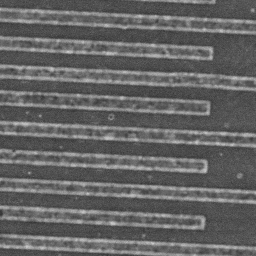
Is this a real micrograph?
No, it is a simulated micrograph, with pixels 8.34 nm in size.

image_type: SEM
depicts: parallel lines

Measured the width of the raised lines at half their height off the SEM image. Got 85.4 nm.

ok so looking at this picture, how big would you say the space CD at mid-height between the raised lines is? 150 nm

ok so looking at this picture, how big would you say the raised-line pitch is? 235 nanometres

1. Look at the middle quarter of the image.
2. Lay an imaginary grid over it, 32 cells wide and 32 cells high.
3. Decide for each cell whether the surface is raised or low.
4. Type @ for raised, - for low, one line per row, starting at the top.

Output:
--------------------------------
@@@-----------------------------
@@@@@@@@@@@@@@@@@@@@@@@---------
@@@@@@@@@@@@@@@@@@@@@@@@@@@@@@@@
----------------@@@@@@@@@@@@@@@@
--------------------------------
--------------------------------
--------------------------------
@@@@@@@@@@----------------------
@@@@@@@@@@@@@@@@@@@@@@@@@@@@@@--
@@@@@@@@@@@@@@@@@@@@@@@@@@@@@@@@
-------------------@@@@@@@@@@@@@
--------------------------------
--------------------------------
--------------------------------
@-------------------------------
@@@@@@@@@@@@@@@@@@@@@-----------
@@@@@@@@@@@@@@@@@@@@@@@@@@@@@@@@
---------@@@@@@@@@@@@@@@@@@@@@@@
------------------------------@@
--------------------------------
--------------------------------
--------------------------------
@@@@@@@@@@@@@@@@@@@@------------
@@@@@@@@@@@@@@@@@@@@@@@@@@@@@@@@
--------@@@@@@@@@@@@@@@@@@@@@@@@
----------------------------@@@@
--------------------------------
--------------------------------
--------------------------------
@@@@@@@@@@@@@@@-----------------
@@@@@@@@@@@@@@@@@@@@@@@@@@@@@@@@